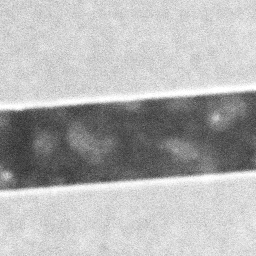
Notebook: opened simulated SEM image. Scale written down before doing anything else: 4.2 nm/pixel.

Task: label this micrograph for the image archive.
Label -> one or a few lines or trenches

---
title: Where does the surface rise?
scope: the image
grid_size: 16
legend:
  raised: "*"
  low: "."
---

****************
****************
****************
****************
****************
****************
****............
................
................
................
................
......**********
****************
****************
****************
****************